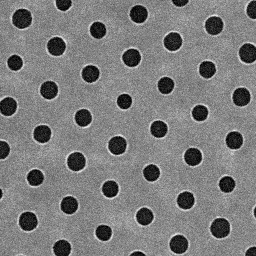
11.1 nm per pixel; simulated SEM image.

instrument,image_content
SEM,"a regular array of holes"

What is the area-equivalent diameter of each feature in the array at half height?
207 nanometers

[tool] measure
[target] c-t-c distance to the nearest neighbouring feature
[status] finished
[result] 485 nm